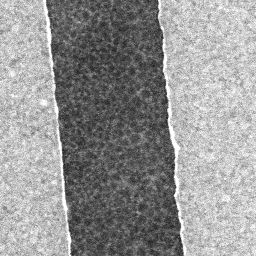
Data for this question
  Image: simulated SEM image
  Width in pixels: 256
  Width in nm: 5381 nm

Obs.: one or a few lines or trenches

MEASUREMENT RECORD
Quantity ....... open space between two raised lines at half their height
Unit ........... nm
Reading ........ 2360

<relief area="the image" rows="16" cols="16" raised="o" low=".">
ooo.......oooooo
ooo.......oooooo
ooo.......oooooo
ooo.......oooooo
ooo.......oooooo
ooo.......oooooo
ooo........ooooo
oooo.......ooooo
oooo.......ooooo
oooo.......ooooo
oooo.......ooooo
oooo.......ooooo
oooo.......ooooo
oooo.......ooooo
oooo.......ooooo
oooo.......ooooo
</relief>